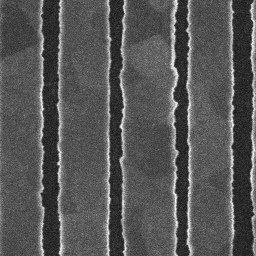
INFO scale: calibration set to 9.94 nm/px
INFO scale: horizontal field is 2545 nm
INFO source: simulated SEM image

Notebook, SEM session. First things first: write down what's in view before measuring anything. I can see one or a few lines or trenches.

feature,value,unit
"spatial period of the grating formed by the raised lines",628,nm